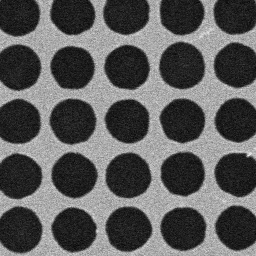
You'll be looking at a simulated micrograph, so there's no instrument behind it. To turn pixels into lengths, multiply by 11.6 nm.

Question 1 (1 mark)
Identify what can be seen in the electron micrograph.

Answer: a regular array of holes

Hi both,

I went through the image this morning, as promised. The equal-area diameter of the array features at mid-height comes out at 524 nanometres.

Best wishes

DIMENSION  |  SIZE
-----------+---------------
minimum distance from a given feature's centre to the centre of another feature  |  0.621 um